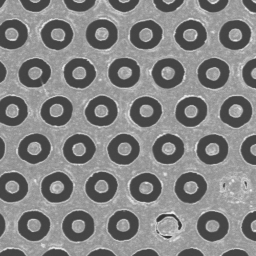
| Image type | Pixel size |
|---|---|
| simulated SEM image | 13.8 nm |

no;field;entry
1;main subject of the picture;a regular array of ring-shaped grooves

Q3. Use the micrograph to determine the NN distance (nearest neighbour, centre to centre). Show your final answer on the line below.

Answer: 606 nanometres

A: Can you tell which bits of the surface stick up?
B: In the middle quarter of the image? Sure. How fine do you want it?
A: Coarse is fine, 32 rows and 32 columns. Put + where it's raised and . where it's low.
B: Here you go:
.......++++........+++........++
...++...+++...+++..+++...++...++
..+++...+++...+++..+++..++++..++
...++...+++...++...+++...++...++
+......+++++......+++++......+++
+.....+++++++....+++++++....++++
++++++++++++++++++++++++++++++++
++++++++++++++++++++++++++++++++
.++++++.....+++++++...++++++++..
..++++.......++++.......+++++...
..++++..++...++++..+++..++++...+
..+++...+++..+++...+++...+++..++
..+++...+++..+++...+++...+++..++
..+++........++++.......++++....
.+++++......++++++.....++++++...
++++++++...++++++++...++++++++..
++++++++++++++++++++++++++++++++
+++..+++++++++..++++++++++++++++
+......++++++.....++++++.....+++
.......++++.......+++++.......++
..+++...+++...+++..+++...+++..++
..+++...+++..++++..+++..++++..++
...++...+++...++...+++....+...++
.......++++.......+++++......+++
+.....++++++.....+++++++....++++
++++++++++++++++++++++++++++++++
++++++++++++++++++++++++++++++++
+++++++.....+++++++...++++++++..
.+++++.......++++......++++++...
..++++..+++..++++...+...++++...+
..+++...+++..+++...+++..++++..++
..+++...+++..+++...+++..+++...++